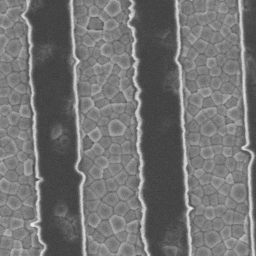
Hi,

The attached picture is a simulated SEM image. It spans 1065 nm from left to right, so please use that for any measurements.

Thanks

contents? one or a few lines or trenches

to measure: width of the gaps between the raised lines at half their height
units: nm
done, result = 255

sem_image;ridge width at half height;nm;188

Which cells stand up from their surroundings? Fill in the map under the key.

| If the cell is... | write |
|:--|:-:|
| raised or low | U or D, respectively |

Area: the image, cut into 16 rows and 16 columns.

DDUUUDDDUUUDDDDU
DDUUUDDDUUUDDDDU
DDUUUDDDUUUDDDDU
DDUUUDDDUUUDDDDU
DDUUUDDDUUUDDDDU
DDUUUDDDDUUDDDDU
DDUUUDDDDUUDDDDU
DDUUUDDDDUUDDDDU
DDUUUDDDDUUUDDDU
DDUUUDDDDUUUDDDD
DDUUUDDDDUUUDDDD
DDUUUDDDDUUUDDDD
DDUUUDDDDUUUDDDD
DDUUUDDDDUUUDDDD
DDUUUDDDDUUUDDDD
DDDUUDDDDUUUDDDD